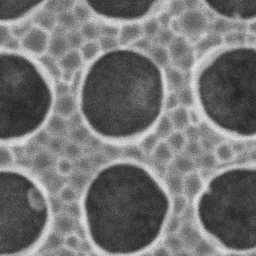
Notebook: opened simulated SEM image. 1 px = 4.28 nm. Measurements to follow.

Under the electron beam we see holes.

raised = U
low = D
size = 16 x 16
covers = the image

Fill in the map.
DDUUUUDDDDUUUDDD
UUUUUUUUUUUUUUUU
UUUUUUUUUUUUUUUU
DUUUUUDDDUUUUDDD
DDUUUDDDDDUUDDDD
DDDUUDDDDDUUDDDD
DDDUUDDDDDUUDDDD
DDDUUDDDDDUUUDDD
DDUUUUDDDUUUUUUD
UUUUUUUUUUUUUUUU
UUUUUUUDDUUUUUUD
DDUUUUDDDDUUUDDD
DDDUUDDDDDUUUDDD
DDDUUDDDDDUUDDDD
DDDUUUDDDDUUUDDD
DDUUUUDDDUUUUUDD